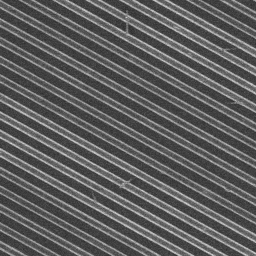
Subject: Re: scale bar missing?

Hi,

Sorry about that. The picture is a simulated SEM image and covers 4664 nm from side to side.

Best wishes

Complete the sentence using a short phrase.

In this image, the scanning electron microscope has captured parallel lines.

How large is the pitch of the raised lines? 296 nm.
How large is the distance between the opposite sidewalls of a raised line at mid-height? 6.45 px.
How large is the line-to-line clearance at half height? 185 nm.